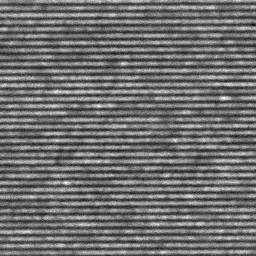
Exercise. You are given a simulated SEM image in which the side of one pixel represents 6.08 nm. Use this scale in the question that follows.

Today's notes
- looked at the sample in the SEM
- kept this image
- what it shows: parallel lines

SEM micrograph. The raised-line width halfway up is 16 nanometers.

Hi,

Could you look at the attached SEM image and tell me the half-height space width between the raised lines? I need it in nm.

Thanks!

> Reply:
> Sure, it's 26.6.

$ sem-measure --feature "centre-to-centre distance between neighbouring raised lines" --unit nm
42.5